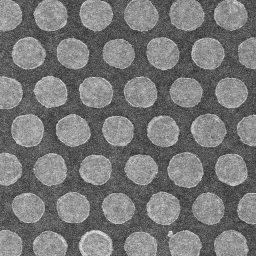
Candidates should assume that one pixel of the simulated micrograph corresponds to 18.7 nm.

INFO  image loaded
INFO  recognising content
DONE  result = a regular array of raised bodies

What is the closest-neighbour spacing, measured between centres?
0.827 microns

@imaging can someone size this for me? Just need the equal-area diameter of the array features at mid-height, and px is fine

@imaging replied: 31.4